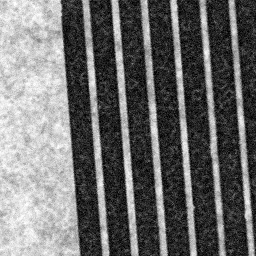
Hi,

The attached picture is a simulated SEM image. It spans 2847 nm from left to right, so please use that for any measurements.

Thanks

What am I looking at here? parallel lines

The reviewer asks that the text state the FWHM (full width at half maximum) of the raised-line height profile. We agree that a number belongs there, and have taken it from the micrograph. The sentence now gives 66.5 nanometres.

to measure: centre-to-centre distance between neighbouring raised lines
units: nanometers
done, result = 323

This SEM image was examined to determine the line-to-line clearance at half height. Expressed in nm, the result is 256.